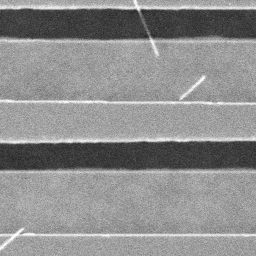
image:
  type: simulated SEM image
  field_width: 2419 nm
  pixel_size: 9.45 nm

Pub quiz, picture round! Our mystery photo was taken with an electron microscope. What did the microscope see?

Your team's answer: lines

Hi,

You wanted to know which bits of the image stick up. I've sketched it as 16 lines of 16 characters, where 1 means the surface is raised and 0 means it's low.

1111100111111111
0000000000000000
0000000000000000
1111111111111111
1111111111111111
1111111111111111
1111111111111111
1111111111111111
1111111111111111
0000000000000000
0000000000000000
1111111111111111
1111111111111111
1111111111111111
1111111111111111
1111111111111111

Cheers